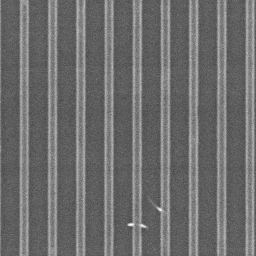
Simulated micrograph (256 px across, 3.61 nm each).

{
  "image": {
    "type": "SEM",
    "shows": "parallel lines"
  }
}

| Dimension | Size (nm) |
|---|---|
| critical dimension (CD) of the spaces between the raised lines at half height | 73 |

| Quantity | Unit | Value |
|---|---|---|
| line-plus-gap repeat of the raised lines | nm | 102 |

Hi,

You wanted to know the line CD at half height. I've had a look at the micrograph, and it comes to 27.9 nanometres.